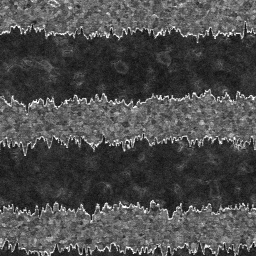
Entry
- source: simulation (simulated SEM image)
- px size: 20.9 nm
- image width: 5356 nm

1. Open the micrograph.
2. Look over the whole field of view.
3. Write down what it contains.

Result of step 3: one or a few lines or trenches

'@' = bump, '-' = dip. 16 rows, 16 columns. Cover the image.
@@@@@@@@@@@@@@@@
@@@@@@@@@@@@@@@@
----------------
----------------
----------------
----------------
@-@@@@@@@@@@@@@@
@@@@@@@@@@@@@@@@
@@@@@@@@@@@@@@@@
----------------
----------------
----------------
----------------
@@@@@@@@@@@@@@@@
@@@@@@@@@@@@@@@@
-@@@@@@@@@@-@@@-